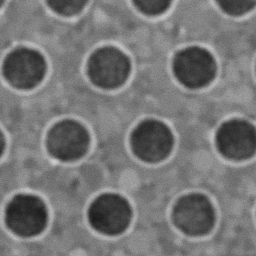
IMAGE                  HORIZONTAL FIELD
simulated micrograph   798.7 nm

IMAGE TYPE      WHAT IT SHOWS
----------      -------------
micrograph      holes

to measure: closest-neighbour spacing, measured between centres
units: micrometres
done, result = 0.262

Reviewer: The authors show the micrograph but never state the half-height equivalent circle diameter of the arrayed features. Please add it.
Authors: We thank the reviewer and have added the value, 156 nm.